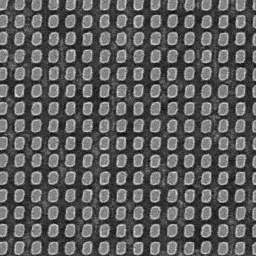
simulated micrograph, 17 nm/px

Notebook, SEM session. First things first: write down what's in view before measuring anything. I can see a regular array of raised bodies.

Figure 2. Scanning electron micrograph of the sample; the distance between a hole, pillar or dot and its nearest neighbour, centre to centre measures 286 nanometers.